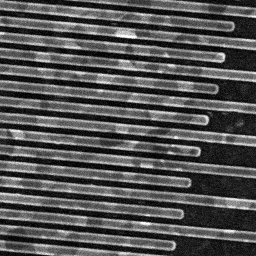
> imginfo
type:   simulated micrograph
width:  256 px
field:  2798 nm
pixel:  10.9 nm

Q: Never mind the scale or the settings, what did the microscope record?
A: parallel lines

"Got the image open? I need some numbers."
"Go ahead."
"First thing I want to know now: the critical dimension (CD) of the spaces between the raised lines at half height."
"77.5 nm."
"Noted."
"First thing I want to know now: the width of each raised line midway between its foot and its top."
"96.6 nanometers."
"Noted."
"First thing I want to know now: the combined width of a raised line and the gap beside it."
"174 nm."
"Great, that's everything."